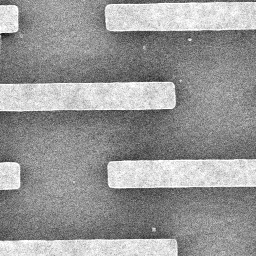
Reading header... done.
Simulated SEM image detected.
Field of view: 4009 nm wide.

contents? groups of lines, slits or small figures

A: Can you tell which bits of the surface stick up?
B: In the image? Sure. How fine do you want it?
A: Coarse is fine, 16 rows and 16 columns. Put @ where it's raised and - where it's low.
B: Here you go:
@------@@@@@@@@@
@------@@@@@@@@@
----------------
----------------
----------------
@@@@@@@@@@@-----
@@@@@@@@@@@-----
----------------
----------------
----------------
@------@@@@@@@@@
@------@@@@@@@@@
----------------
----------------
----------------
@@@@@@@@@@@-----